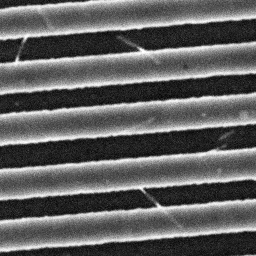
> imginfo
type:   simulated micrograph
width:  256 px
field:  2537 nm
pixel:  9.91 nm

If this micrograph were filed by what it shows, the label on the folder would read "lines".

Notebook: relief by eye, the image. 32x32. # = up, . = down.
.......#########################
################################
############################....
#################...............
####............................
..............................##
.................###############
......##########################
################################
##########################......
#############...................
#...............................
.....................###########
..........######################
################################
###############################.
####################............
#######.........................
................................
......................##########
..........######################
################################
#############################...
##################..............
######..........................
..........................######
.............###################
..##############################
################################
########################........
############....................
................................